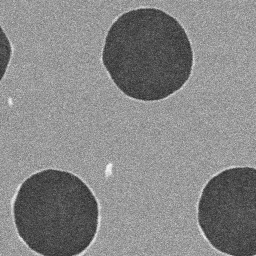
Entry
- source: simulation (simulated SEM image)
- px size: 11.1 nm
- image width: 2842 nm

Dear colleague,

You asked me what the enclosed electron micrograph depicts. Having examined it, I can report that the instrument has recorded holes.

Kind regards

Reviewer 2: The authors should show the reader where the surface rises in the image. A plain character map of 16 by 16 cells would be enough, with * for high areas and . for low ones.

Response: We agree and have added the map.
****************
*******....*****
.******.....****
.*****......****
*******.....****
*******....*****
****************
****************
****************
****************
***************.
*....********...
*.....******....
*.....******....
*.....*******...
**...********...